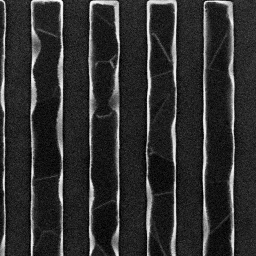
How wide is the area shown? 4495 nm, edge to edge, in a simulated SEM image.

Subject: wiring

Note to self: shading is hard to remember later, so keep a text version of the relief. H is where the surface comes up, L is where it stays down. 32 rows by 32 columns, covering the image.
HLLLHHHHLLLLHHLLLLLHHHLLLLHHLLLL
HLLLHHHHLLLHHHHLLLLHHHLLLLHHHLLL
HLLLHHHHLLLHHHHLLLLHHHLLLLHHHLLL
HLLLHHHHLLLHHHHLLLLHHHLLLLHHHLLL
HLLLHHHHLLLHHHHLLLLHHHLLLLHHHLLL
HLLLLHHHLLLHHHHLLLLHHHLLLLHHHLLL
HLLLHHHHLLLHHHHLLLLHHHLLLLHHHLLL
HLLLHHHHLLLHHHHLLLLHHHLLLLHHHLLL
LLLLHHHHLLLHHHHLLLLHHHLLLLHHHLLL
HLLLHHHHLLLHHHHLLLLHHHLLLHHHHLLL
LLLLHHHHLLLHHHHLLLLHHHLLLHHHHLLL
LLLLHHHHLLLHHHHLLLLHHHLLLLHHHLLL
LLLLHHHHLLLHHHLLLLLHHHLLLLHHHLLL
HLLLHHHHLLLHHHHLLLLHHHLLLLHHHLLL
HLLLHHHHLLLHHHHLLLLHHHLLLLHHHLLL
HLLLHHHLLLLHHHHLLLLHHHLLLLHHHLLL
HLLLHHHLLLLHHHHLLLHHHHLLLLHHHLLL
HLLLHHHHLLLHHHHLLLHHHHLLLLHHHLLL
HLLLHHHHLLLHHHHLLLHHHHLLLLHHHLLL
HLLLHHHHLLLHHHHLLLHHHHLLLLHHHLLL
HLLLHHHHLLLHHHHLLLHHHHLLLLHHHLLL
HLLLHHHHLLLHHHHLLLHHHHLLLHHHHLLL
HLLLHHHHLLLHHHHLLLHHHHLLLHHHHLLL
HLLLHHHHLLLHHHHLLLLHHHLLLHHHHLLL
HLLLHHHHLLLLHHHLLLLHHHLLLLHHHLLL
HLLLHHHHLLLHHHHLLLLHHHLLLLHHHLLL
HLLLHHHHLLLHHHHLLLLHHHLLLLHHHLLL
HLLLHHHHLLLHHHHLLLLHHHLLLLHHHLLL
HLLLHHHHLLLHHHHLLLLHHHLLLLHHHLLL
HLLLHHHHLLLHHHHLLLLHHHLLLLHHHLLL
LLLLHHHHLLLLHHLLLLHHHHLLLLHHHLLL
LLLLHHHHLLLHHHHLLLHHHHLLLHHHHLLL